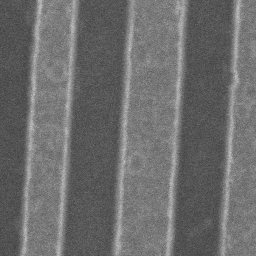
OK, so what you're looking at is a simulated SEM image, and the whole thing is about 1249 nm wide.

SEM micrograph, one or a few lines or trenches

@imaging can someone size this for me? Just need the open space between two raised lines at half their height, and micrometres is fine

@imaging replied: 0.256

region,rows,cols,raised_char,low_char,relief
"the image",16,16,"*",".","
..***...****...*
..***...****...*
..***...***....*
..***...***....*
..***...***....*
..**....***...**
..**....***...**
..**....***...**
..**....***...**
..**....***...**
..**...****...**
..**...****...**
..**...****...**
.***...****...**
.***...****...**
.***...****...**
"